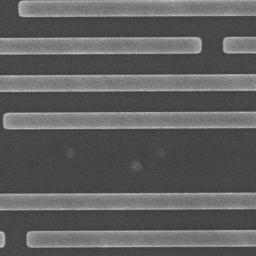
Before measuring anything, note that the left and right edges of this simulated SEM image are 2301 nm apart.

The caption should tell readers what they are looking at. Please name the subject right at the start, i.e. groups of lines, slits or small figures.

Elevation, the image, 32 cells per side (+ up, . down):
..++++++++++++++++++++++++++++++
..++++++++++++++++++++++++++++++
................................
................................
................................
+++++++++++++++++++++++++...++++
+++++++++++++++++++++++++...++++
................................
................................
++++++++++++++++++++++++++++++++
++++++++++++++++++++++++++++++++
................................
................................
................................
.+++++++++++++++++++++++++++++++
++++++++++++++++++++++++++++++++
................................
................................
................................
................................
................................
................................
................................
................................
++++++++++++++++++++++++++++++++
++++++++++++++++++++++++++++++++
................................
................................
................................
...+++++++++++++++++++++++++++++
...+++++++++++++++++++++++++++++
................................